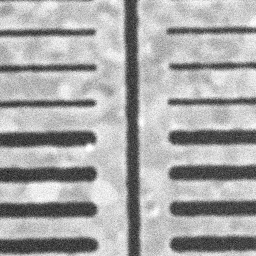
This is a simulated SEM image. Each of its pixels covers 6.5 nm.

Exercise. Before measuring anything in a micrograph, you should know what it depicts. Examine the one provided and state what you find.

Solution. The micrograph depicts groups of lines, slits or small figures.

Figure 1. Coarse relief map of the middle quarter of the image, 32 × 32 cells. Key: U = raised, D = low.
DDDDDDDDUUUUUUUDDDDUUUUUUUDDDDDD
DDDDDDDDUUUUUUUDDDDUUUUUUUUDDDDD
UUUUUUUUUUUUUUUDDDDUUUUUUUUUUUUU
UUUUUUUUUUUUUUUDDDDUUUUUUUUUUUUU
UUUUUUUUUUUUUUUDDDDUUUUUUUUUUUUU
UUUUUUUUUUUUUUUDDDDUUUUUUUUUUUUU
UUUUUUUUUUUUUUUDDDDUUUUUUUUUUUUU
UUUUUUUUUUUUUUUDDDDUUUUUUUUUUUUU
UUUUUUDUUUUUUUUDDDDUUUUUUUDDDDDD
DDDDDDDDUUUUUUUDDDDUUUUUUUDDDDDD
DDDDDDDDUUUUUUUDDDDUUUUUUUDDDDDD
UUUUUUUUUUUUUUUDDDDUUUUUUUUUUUUU
UUUUUUUUUUUUUUUDDDDUUUUUUUUUUUUU
UUUUUUUUUUUUUUUDDDDUUUUUUUUUUUUU
UUUUUUUUUUUUUUUDDDDUUUUUUUUUUUUU
UUUUUUUUUUUUUUUDDDDUUUUUUUUUUUUU
UDDDDDDUUUUUUUUDDDDUUUUUUUUDDDDD
DDDDDDDDUUUUUUUDDDDUUUUUUUDDDDDD
DDDDDDDDDUUUUUUDDDDUUUUUUUDDDDDD
DDDDDDDDUUUUUUUDDDDUUUUUUUDDDDDD
DDDDDDUDUUUUUUUDDDDUUUUUUUUUDDDD
UUUUUUUUUUUUUUUDDDDUUUUUUUUUUUUU
UUUUUUUUUUUUUUUDDDDUUUUUUUUUUUUU
UUUUUUUUUUUUUUUDDDDUUUUUUUUUUUUU
UUUUUUUUUUUUUUUDDDDUUUUUUUUUUUUU
UUDDDDDUUUUUUUUDDDDUUUUUUUUDDDDD
DDDDDDDDUUUUUUUDDDDUUUUUUUDDDDDD
DDDDDDDDDUUUUUUDDDDUUUUUUUDDDDDD
DDDDDDDDUUUUUUUDDDDUUUUUUUDDDDDD
DDDDDDDUUUUUUUUDDDDUUUUUUUUUDDDD
UUUUUUUUUUUUUUUDDDDUUUUUUUUUUUUU
UUUUUUUUUUUUUUUDDDDUUUUUUUUUUUUU